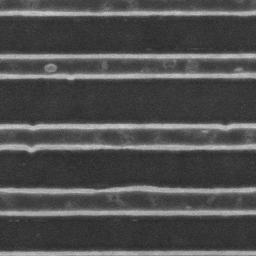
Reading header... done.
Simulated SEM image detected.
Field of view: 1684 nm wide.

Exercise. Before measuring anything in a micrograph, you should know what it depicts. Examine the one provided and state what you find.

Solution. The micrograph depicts one or a few lines or trenches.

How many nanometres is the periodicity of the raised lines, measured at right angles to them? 445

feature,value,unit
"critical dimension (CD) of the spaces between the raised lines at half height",277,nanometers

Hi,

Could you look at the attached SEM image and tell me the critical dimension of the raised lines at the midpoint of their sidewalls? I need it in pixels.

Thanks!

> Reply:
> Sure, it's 21.5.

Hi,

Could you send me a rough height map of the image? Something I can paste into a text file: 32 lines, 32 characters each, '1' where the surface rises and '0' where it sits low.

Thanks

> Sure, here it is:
11111111111111111111111111111111
11111111111111111111111111111111
00000000000000000000000000000000
00000000000000000000000000000000
00000000000000000000000000000000
00000000000000000000000000000000
00000000000000000000000000000000
11111111111111111111111111111111
11111111111111111111111111111111
11111111111111111000000000000000
00000000000000000000000000000000
00000000000000000000000000000000
00000000000000000000000000000000
00000000000000000000000000000000
00000000000000000000000000000000
00000000000000000000000000000000
11111111111111111111111111111111
11111111111111111111111111111111
00011000000000000001000100000000
00000000000000000000000000000000
00000000000000000000000000000000
00000000000000000000000000000000
00000000000000000000000000000000
00000000000000000000000000000000
11111111111111111111111111111111
11111111111111111111111111111111
11111111111111111111111111111111
00000000000000000000000000000000
00000000000000000000000000000000
00000000000000000000000000000000
00000000000000000000000000000000
00000000000000000000000000000000